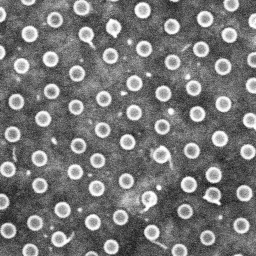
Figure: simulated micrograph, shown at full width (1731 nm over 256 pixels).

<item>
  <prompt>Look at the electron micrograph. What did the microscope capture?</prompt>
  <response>a regular array of raised bodies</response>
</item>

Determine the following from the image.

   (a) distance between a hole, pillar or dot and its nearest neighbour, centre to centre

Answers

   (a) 0.196 microns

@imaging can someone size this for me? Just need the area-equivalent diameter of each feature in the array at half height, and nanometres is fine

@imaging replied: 94.6